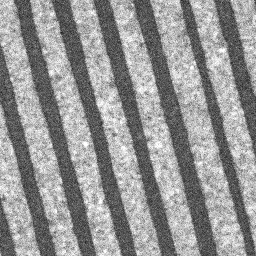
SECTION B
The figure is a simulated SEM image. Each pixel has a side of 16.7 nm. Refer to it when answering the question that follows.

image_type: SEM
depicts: parallel lines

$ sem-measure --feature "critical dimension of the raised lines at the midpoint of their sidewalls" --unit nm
373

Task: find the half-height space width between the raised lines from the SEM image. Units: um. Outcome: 0.27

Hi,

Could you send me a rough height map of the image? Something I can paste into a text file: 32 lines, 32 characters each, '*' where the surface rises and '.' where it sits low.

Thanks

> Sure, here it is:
**..**...***..***..***..***..***
**..***..***..***..****.***..***
**..***..***...**...***.***...**
**...**...***..**...***..***..**
***..***..***..***..***..***..**
***..***..***..***..****.***..**
.**..***...**...**...***..**...*
.**...**...**...***..***..***..*
.***..***..***..***..****.***..*
.***..***..***..***..****.***..*
..**..***...**...**...***..**..*
..**...***..***..***..***..***..
..***..***..***..***..****.***..
..***..***..***..***...***.***..
...**...***..***..**...***..***.
*..***..***..***..***..***..***.
*..***..***..***..***..****.***.
*..***..***..***..***...***.***.
**..***..***..***..***..***..***
**..***..***..***..***..***..***
**..***..***..***..***..****.***
**..***...**..***..***...***..**
***..***..***..***..***..***..**
***..***..***..***..***..****.**
***..***..***..***..***...***.**
***...**...**..***...**...***..*
.***..***..***..***..***..***..*
.***..***..***..***..***..****.*
.***..***..***..***..***...***.*
.***..***..***...***..**...***..
..***..***..***..***..***..***..
..***..***..***..***..***..****.